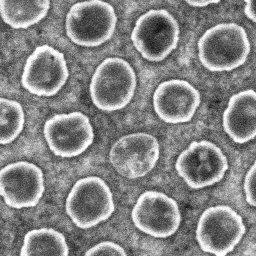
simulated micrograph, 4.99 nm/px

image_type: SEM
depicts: a regular array of raised bodies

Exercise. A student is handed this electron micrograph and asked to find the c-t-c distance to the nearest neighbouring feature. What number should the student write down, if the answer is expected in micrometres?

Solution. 0.329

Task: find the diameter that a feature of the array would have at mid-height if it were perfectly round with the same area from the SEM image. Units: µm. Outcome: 0.226